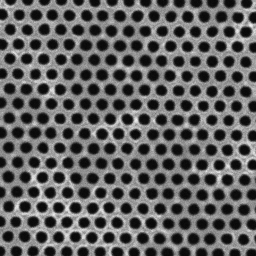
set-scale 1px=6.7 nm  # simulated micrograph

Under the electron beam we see a regular array of holes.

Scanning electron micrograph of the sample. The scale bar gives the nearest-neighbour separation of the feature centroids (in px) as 16.5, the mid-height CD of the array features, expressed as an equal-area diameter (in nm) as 81.8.